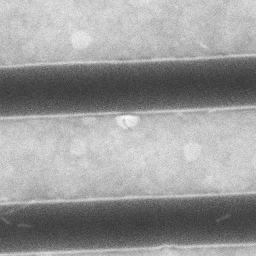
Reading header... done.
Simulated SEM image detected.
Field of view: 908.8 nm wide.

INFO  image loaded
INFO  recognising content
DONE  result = one or a few lines or trenches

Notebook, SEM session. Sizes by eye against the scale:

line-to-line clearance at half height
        297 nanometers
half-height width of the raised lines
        187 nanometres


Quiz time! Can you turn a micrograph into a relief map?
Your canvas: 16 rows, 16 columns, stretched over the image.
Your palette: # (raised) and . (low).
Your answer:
................
................
................
..............##
################
################
################
................
................
................
................
................
....############
################
################
##########......